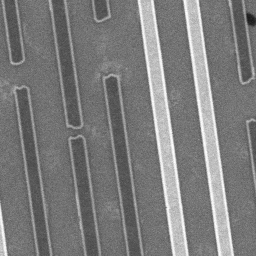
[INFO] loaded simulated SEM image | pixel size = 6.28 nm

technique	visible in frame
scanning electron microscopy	parallel lines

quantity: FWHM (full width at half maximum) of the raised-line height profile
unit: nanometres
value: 84.7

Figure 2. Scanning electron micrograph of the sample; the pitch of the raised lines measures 282 nanometers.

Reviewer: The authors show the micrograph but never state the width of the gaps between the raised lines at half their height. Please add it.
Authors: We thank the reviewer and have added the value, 202 nanometres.